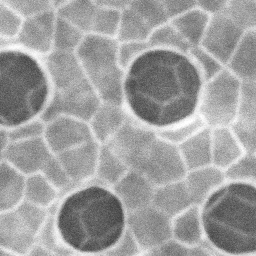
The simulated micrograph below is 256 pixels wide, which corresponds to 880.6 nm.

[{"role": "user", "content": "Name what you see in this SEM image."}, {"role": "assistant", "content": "holes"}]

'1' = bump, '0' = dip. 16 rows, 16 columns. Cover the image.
1111111111111111
1111111111111111
1111111111111111
0011111110011111
0001111100001111
0001111100000111
0001111100001111
0011111110001111
1111111111111111
1111111111111111
1111111111111111
1111111111111100
1111000111111000
1111000011111000
1111000011111000
1111100111111100